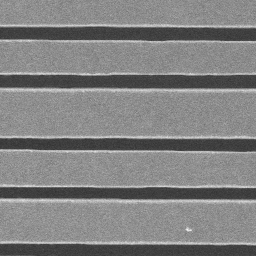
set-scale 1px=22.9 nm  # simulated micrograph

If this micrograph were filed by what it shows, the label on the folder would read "lines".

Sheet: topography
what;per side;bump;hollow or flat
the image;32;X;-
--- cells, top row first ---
XXXXXXXXXXXXXXXXXXXXXXXXXXXXXXXX
XXXXXXXXXXXXXXXXXXXXXXXXXXXXXXXX
XXXXXXXXXXXXXXXXXXXXXXXXXXXXXXXX
--------------------------------
--------------------------------
XXXXXXXXXXXXXXXXXXXXXXXXXXXXXXXX
XXXXXXXXXXXXXXXXXXXXXXXXXXXXXXXX
XXXXXXXXXXXXXXXXXXXXXXXXXXXXXXXX
XXXXXXXXXXXXXXXXXXXXXXXXXXXXXXXX
--------------------------------
--------------------------------
XXXXXXXXXXXXXXXXXXXXXXXXXXXXXXXX
XXXXXXXXXXXXXXXXXXXXXXXXXXXXXXXX
XXXXXXXXXXXXXXXXXXXXXXXXXXXXXXXX
XXXXXXXXXXXXXXXXXXXXXXXXXXXXXXXX
XXXXXXXXXXXXXXXXXXXXXXXXXXXXXXXX
XXXXXXXXXXXXXXXXXXXXXXXXXXXXXXXX
--------------------------------
--------------------------------
XXXXXXXXXXXXXXXXXXXXXXXXXXXXXXXX
XXXXXXXXXXXXXXXXXXXXXXXXXXXXXXXX
XXXXXXXXXXXXXXXXXXXXXXXXXXXXXXXX
XXXXXXXXXXXXXXXXXXXXXXXXXXXXXXXX
--------------------------------
--------------------------------
XXXXXXXXXXXXXXXXXXXXXXXXXXXXXXXX
XXXXXXXXXXXXXXXXXXXXXXXXXXXXXXXX
XXXXXXXXXXXXXXXXXXXXXXXXXXXXXXXX
XXXXXXXXXXXXXXXXXXXXXXXXXXXXXXXX
XXXXXXXXXXXXXXXXXXXXXXXXXXXXXXXX
----------XXXXXXXXXXXXXXXXXXXXXX
--------------------------------